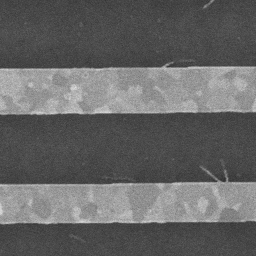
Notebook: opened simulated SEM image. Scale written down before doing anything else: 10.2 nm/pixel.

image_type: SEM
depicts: lines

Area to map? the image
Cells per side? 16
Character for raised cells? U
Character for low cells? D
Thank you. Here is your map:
DDDDDDDDDDDDDDDD
DDDDDDDDDDDDDDDD
DDDDDDDDDDDDDDDD
DDDDDDDDDDDDDDDD
UUUUUUUUUUUUUUUU
UUUUUUUUUUUUUUUU
UUUUUUUUUUUUUUUU
DDDDDDDDDDDDDDDD
DDDDDDDDDDDDDDDD
DDDDDDDDDDDDDDDD
DDDDDDDDDDDDDDDD
DDDDDDDUUUUUUUUU
UUUUUUUUUUUUUUUU
UUUUUUUUUUUUUUUU
DDDDDDDDDDDDDDDD
DDDDDDDDDDDDDDDD